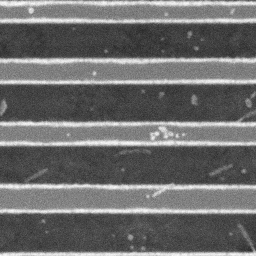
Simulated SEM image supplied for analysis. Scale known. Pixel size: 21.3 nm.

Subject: lines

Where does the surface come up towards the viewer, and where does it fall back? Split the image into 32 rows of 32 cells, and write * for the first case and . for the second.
********************************
********************************
********************************
................................
................................
................................
................................
********************************
********************************
********************************
................................
................................
................................
................................
................................
********************************
********************************
********************************
................................
................................
................................
................................
................................
********************************
********************************
********************************
...............................*
................................
................................
................................
................................
................................